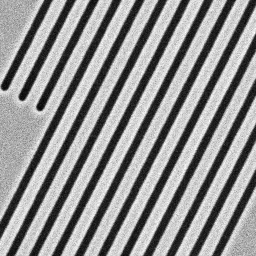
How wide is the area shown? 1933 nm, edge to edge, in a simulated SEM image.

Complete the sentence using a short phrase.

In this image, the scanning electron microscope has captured groups of lines, slits or small figures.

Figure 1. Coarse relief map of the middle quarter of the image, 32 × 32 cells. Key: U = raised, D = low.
UUUUDDUUUDDDUUUDDDUUUDDUUUUDDUUU
UUUDDDUUUDDUUUUDDUUUDDDUUUDDUUUU
UUUDDUUUDDDUUUDDDUUUDDUUUUDDUUUD
UUDDDUUUDDUUUUDDUUUDDDUUUDDDUUUD
UUDDUUUDDDUUUDDUUUUDDUUUDDDUUUDD
UDDDUUUDDUUUUDDUUUDDDUUUDDUUUUDD
UDDUUUDDDUUUDDUUUUDDUUUUDDUUUDDD
DDDUUUDDUUUUDDUUUDDDUUUDDDUUUDDU
DDUUUDDDUUUDDDUUUDDUUUUDDUUUDDDU
DDUUUDDUUUUDDUUUDDDUUUDDUUUUDDUU
DUUUDDDUUUDDUUUUDDUUUDDDUUUDDDUU
DUUUDDUUUUDDUUUDDDUUUDDDUUUDDUUU
UUUDDDUUUDDDUUUDDUUUUDDUUUDDDUUU
UUUDDUUUDDDUUUDDDUUUDDUUUUDDUUUD
UUDDDUUUDDUUUUDDUUUDDDUUUDDDUUUD
UUDDUUUUDDUUUDDDUUUDDUUUUDDUUUDD
UDDDUUUDDDUUUDDUUUDDDUUUDDDUUUDD
UDDUUUUDDUUUDDDUUUDDUUUUDDUUUDDD
DDDUUUDDUUUUDDUUUDDDUUUDDDUUUDDU
DDUUUDDDUUUDDDUUUDDUUUUDDUUUDDDU
DDUUUDDUUUUDDUUUUDDUUUDDDUUUDDUU
DUUUUDDUUUDDDUUUDDUUUUDDUUUDDDUU
DUUUDDUUUUDDUUUDDDUUUDDDUUUDDUUU
UUUDDDUUUDDDUUUDDUUUUDDUUUDDDUUU
UUUDDUUUUDDUUUDDDUUUDDDUUUDDUUUU
UUUDDUUUDDDUUUDDUUUUDDUUUDDDUUUD
UUDDUUUUDDUUUDDDUUUDDDUUUDDUUUUD
UDDDUUUDDDUUUDDUUUUDDUUUDDDUUUDD
UDDUUUUDDUUUDDDUUUDDDUUUDDUUUUDD
UDDUUUDDDUUUDDUUUUDDUUUDDDUUUDDU
DDUUUUDDUUUDDDUUUDDUUUUDDUUUDDDU
DDUUUDDDUUUDDUUUUDDUUUDDDUUUDDUU